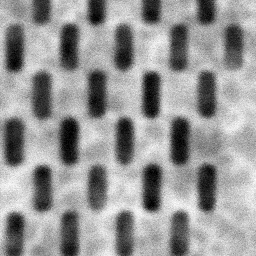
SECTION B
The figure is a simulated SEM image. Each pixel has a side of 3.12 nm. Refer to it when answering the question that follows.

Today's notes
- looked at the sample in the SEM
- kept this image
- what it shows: a regular array of holes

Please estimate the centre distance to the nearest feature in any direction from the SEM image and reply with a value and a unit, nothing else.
168 nm